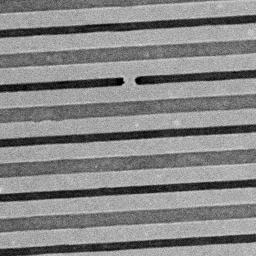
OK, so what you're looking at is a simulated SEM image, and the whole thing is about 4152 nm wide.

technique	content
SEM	parallel lines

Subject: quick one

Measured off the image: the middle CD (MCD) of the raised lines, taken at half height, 249 nanometres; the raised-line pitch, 444 nm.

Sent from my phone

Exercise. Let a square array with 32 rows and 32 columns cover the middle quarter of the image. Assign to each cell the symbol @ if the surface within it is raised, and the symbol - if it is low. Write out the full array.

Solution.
@@@@@@@@@@@@@@@@@@@@@@@@@@@@@@@@
@@@@@@@@@@@@@@@@@@@@@@@@@@@@@@@@
@@@@@@@@@@@@@@@@@@@@@@@@@@------
@@@@@@@@@------@@@--------------
---------------@@@--------------
--------------@@@@@@@@@@@@@@@@@@
@@@@@@@@@@@@@@@@@@@@@@@@@@@@@@@@
@@@@@@@@@@@@@@@@@@@@@@@@@@@@@@@@
@@@@@@@@@@@@@@@@@@@@@@@@@@------
@@@@@@@@@-----------------------
--------------------------------
--------------------------------
---------------------------@@@@@
----------@@@@@@@@@@@@@@@@@@@@@@
@@@@@@@@@@@@@@@@@@@@@@@@@@@@@@@@
@@@@@@@@@@@@@@@@@@@@@@@@@@@@@@@@
@@@@@@@@@@@@@@@@@@@@@-----------
@@@@----------------------------
---------------------------@@@@@
----------@@@@@@@@@@@@@@@@@@@@@@
@@@@@@@@@@@@@@@@@@@@@@@@@@@@@@@@
@@@@@@@@@@@@@@@@@@@@@@@@@@@@@@@@
@@@@@@@@@@@@@@@@@@@@@-----------
@@@@----------------------------
--------------------------------
--------------------------------
----------------------@@@@@@@@@@
-----@@@@@@@@@@@@@@@@@@@@@@@@@@@
@@@@@@@@@@@@@@@@@@@@@@@@@@@@@@@@
@@@@@@@@@@@@@@@@@@@@@@@@@@@@@@@@
@@@@@@@@@@@@@@@-----------------
--------------------------------